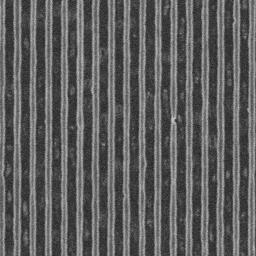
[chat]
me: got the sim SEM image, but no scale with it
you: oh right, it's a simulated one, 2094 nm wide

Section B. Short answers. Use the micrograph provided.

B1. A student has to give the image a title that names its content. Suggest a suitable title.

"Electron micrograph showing parallel lines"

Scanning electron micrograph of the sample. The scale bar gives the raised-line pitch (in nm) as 128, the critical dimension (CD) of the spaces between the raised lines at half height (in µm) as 0.0818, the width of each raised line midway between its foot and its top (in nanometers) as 45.